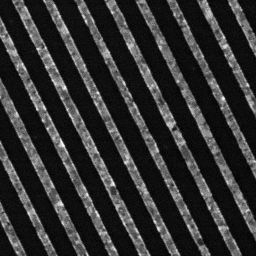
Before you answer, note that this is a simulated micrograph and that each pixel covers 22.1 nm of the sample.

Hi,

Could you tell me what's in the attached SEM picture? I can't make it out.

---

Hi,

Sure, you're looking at parallel lines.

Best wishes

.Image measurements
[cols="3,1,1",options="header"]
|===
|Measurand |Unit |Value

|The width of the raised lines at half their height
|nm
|173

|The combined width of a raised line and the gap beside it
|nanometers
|608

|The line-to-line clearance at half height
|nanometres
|441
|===